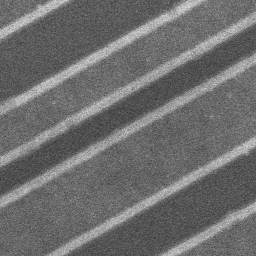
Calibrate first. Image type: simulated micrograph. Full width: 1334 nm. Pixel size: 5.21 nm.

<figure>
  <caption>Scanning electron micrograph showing one or a few lines or trenches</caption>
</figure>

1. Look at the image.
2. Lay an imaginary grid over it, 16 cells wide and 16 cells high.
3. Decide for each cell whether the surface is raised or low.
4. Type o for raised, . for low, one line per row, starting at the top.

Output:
ooo........ooooo
o.........ooooo.
........oooooo..
......oooooo....
....oooooo....oo
..oooooo.....ooo
.oooooo....ooooo
ooooo....ooooooo
ooo....ooooooooo
o.....ooooooooo.
....ooooooooo...
..ooooooooo.....
oooooooooo......
oooooooo.......o
oooooo.......ooo
oooo.......ooooo